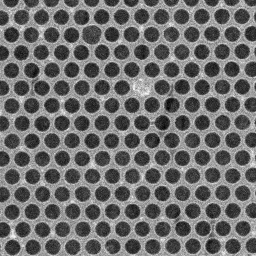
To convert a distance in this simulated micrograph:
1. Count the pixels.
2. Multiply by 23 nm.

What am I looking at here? a regular array of holes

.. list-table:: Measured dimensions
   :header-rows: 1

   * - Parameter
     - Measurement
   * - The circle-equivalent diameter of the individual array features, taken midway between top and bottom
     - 16.1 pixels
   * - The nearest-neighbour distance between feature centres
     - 454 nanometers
